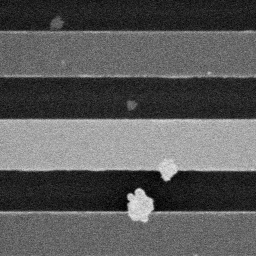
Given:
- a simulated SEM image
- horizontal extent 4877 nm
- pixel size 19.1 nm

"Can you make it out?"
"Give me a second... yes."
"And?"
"lines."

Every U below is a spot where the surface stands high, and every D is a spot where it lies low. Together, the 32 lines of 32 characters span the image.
DDDDDDDDDDDDDDDDDDDDDDDDDDDDDDDD
DDDDDDDDDDDDDDDDDDDDDDDDDDDDDDDD
DDDDDDDDDDDDDDDDDDDDDDDDDDDDDDDD
DDDDDDDDDDDDDDDDDDDDDDDDDDDDDDDD
UUUUUUUUUUUUUUUUUUUUUUUUUUUUUUUU
UUUUUUUUUUUUUUUUUUUUUUUUUUUUUUUU
UUUUUUUUUUUUUUUUUUUUUUUUUUUUUUUU
UUUUUUUUUUUUUUUUUUUUUUUUUUUUUUUU
UUUUUUUUUUUUUUUUUUUUUUUUUUUUUUUU
UUUUUUUUUUUUUUUUUUUUUUUUUUUUUUUU
DDDDDDDDDDDDDDDDDDDDDDDDDDDDDDDD
DDDDDDDDDDDDDDDDDDDDDDDDDDDDDDDD
DDDDDDDDDDDDDDDDDDDDDDDDDDDDDDDD
DDDDDDDDDDDDDDDDDDDDDDDDDDDDDDDD
DDDDDDDDDDDDDDDDDDDDDDDDDDDDDDDD
UUUUUUUUUUUUUUUUUUUUUUUUUUUUUUUU
UUUUUUUUUUUUUUUUUUUUUUUUUUUUUUUU
UUUUUUUUUUUUUUUUUUUUUUUUUUUUUUUU
UUUUUUUUUUUUUUUUUUUUUUUUUUUUUUUU
UUUUUUUUUUUUUUUUUUUUUUUUUUUUUUUU
UUUUUUUUUUUUUUUUUUUUUUUUUUUUUUUU
DDDDDDDDDDDDDDDDDDDDUUDDDDDDDDDD
DDDDDDDDDDDDDDDDDDDDDDDDDDDDDDDD
DDDDDDDDDDDDDDDDDDDDDDDDDDDDDDDD
DDDDDDDDDDDDDDDDUUDDDDDDDDDDDDDD
DDDDDDDDDDDDDDDDUUUDDDDDDDDDDDDD
DDDDDDDDDDDDDDDDUUUUDDDDDDDDDDDD
UUUUUUUUUUUUUUUUUUUUUUUUUUUUUUUU
UUUUUUUUUUUUUUUUUUUUUUUUUUUUUUUU
UUUUUUUUUUUUUUUUUUUUUUUUUUUUUUUU
UUUUUUUUUUUUUUUUUUUUUUUUUUUUUUUU
UUUUUUUUUUUUUUUUUUUUUUUUUUUUUUUU